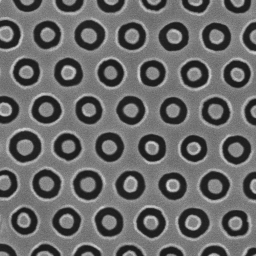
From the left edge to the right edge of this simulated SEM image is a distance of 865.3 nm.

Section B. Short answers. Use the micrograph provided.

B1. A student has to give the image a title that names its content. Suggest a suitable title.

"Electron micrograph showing a regular array of ring-shaped grooves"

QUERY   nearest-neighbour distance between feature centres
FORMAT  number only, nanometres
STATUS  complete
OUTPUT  141